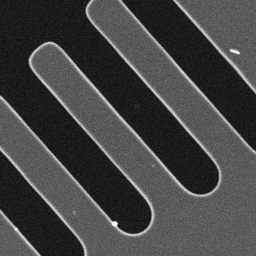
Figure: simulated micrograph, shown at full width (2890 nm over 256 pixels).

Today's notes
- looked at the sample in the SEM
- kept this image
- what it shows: groups of lines, slits or small figures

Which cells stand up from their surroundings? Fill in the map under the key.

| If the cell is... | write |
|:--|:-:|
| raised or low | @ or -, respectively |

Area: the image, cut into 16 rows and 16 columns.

-----@@@---@@@@@
------@@@---@@@@
-------@@@---@@@
--@@----@@@---@@
--@@@---@@@----@
---@@@---@@@----
----@@@---@@@---
@----@@@---@@@--
@@----@@@---@@@-
@@@---@@@@---@@@
-@@@---@@@----@@
--@@@---@@@---@@
---@@@---@@@@@@@
----@@@--@@@@@@@
@----@@@-@@@@@@@
@@---@@@@@@@@@@@